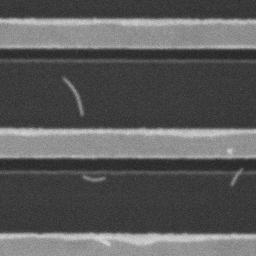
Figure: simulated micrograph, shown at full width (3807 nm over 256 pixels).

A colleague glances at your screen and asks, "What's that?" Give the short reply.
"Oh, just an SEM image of lines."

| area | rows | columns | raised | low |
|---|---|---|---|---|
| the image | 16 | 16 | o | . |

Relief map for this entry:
................
oooooooooooooooo
oooooooooooooooo
................
................
................
................
................
oooooooooooooooo
oooooooooooooooo
................
................
................
................
................
oooooooooooooooo